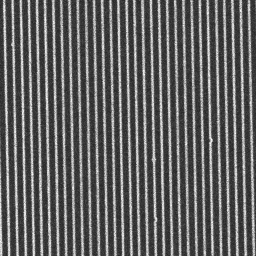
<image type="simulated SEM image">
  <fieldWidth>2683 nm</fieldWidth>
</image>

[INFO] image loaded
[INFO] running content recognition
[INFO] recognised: parallel lines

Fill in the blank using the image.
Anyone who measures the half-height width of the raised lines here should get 0.0275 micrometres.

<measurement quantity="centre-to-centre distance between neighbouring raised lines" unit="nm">85.4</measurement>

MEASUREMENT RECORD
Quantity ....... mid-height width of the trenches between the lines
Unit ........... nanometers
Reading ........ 57.6